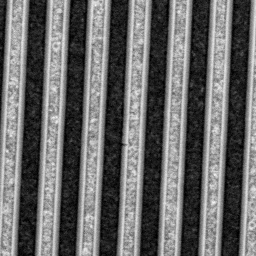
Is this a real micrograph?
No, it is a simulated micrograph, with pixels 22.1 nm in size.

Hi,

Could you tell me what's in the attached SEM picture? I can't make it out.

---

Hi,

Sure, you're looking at parallel lines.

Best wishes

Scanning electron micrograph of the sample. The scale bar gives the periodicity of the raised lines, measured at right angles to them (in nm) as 900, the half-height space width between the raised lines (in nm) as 530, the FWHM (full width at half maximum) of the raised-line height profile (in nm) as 367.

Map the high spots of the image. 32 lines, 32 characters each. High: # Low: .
.##...##...##...###...##...##...
.##...##...##...###...##...##...
.##...##...##...##....##...##...
.##...##...##...##...##....##...
.##...##...##...##...##....#....
.##...##...##...##...##...##....
.##...##...##...##...##...##...#
.##...##...##...##...##...##...#
.##...##...##...##...##...##...#
.##...##...##...##...##...##...#
.##...##...##...##...##...##...#
.##...##...##...##...##...##...#
.##...##...##...##...##...##...#
.##...##...##...##...##...##...#
###...##...##...##...##...##...#
###...##...##...##...##...##...#
##....##...##...##...##...##...#
##....##...##...##...##...##...#
##...##....##...##...##...##...#
##...##...##....##...##...##...#
##...##...##....##...##...##...#
##...##...##...###...##...##...#
##...##...##...##...###...##...#
##...##...##...##...###...##...#
##...##...##...##...##....##...#
##...##...##...##...##...##....#
##...##...##...##...##...##....#
##...##...##...##...##...##...##
##...##...##...##...##...##...##
##...##...##...##...##...##...##
##...##...##...##...##...##...##
##...##...##...##...##...##...##